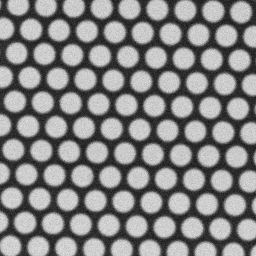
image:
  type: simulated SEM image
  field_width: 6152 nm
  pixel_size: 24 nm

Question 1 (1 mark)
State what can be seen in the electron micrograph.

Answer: an array of small figures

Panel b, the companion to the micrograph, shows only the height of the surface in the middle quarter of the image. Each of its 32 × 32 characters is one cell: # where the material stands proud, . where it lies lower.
........#......##....####...####
....##..........................
#..#####..####....###....###....
#..#####..#####..#####..#####..#
#..#####..#####..#####..#####..#
...####...#####..#####..#####..#
...........##.....###....###...#
.##.............................
####...####...###....###....###.
####..#####..#####..#####..#####
####..#####..#####..#####..#####
####...####..#####..#####..#####
..............###....###....###.
....##..........................
...####...####...####....##.....
#..####..#####...####...####...#
..#####..#####..#####..#####..##
...####...####...####..#####..##
...........##....###....####...#
##..............................
###...####....###....###....##..
####..#####..#####..####...####.
####..#####..#####..#####..#####
###...####...#####..#####..#####
.......##.....###...####...####.
................................
..#####...###....###....###.....
..#####..#####..#####..#####..##
..#####..#####..#####..#####..##
..#####..#####..#####..#####..##
....#.....###....###....###...##
................................